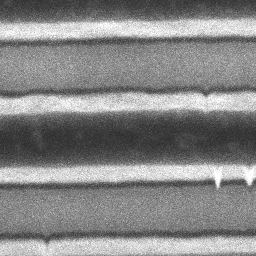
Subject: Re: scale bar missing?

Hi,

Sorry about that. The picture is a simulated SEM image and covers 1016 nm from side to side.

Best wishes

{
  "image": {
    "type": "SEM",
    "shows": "one or a few lines or trenches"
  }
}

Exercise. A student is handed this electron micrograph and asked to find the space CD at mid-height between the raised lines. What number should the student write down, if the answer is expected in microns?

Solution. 0.28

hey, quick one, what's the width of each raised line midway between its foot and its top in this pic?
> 290 nm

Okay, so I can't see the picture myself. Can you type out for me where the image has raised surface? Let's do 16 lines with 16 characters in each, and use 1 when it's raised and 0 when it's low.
1111111111111111
1111111111111111
0000000000000000
0000000000000000
0000000000000000
0000000000000000
0111111111111111
1111111111111111
1111111111111111
1111111111111111
1111111111111111
0000000000000000
0000000000000000
0000000000000000
0000000000000000
1111111111111111